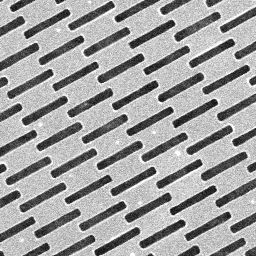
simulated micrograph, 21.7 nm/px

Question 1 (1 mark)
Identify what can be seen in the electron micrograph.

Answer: a regular array of holes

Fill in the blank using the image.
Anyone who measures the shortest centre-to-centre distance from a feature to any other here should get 650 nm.